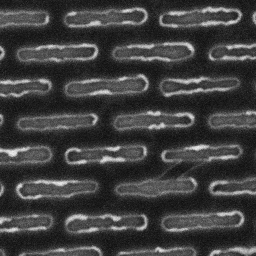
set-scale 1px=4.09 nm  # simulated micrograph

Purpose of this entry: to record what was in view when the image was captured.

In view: a regular array of holes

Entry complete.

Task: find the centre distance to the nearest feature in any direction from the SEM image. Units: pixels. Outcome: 55.8